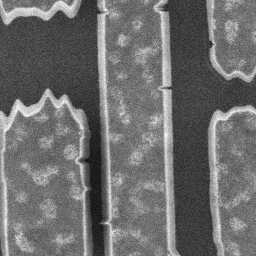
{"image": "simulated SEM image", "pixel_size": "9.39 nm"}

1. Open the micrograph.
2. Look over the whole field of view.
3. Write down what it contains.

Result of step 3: one or a few lines or trenches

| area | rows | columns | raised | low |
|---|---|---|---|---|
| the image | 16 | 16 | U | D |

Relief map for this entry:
UUUUUDUUUUDDDUUU
DDDDDDUUUUDDDUUU
DDDDDDUUUUDDDUUU
DDDDDDUUUUDDDUUU
DDDDDDUUUUDDDDUU
DDDDDDUUUUDDDDDD
DDDUDDUUUUDDDDDD
DUUUUDDUUUDDDUUU
UUUUUDDUUUUDDUUU
UUUUUDDUUUUDDUUU
UUUUUDDUUUUDDUUU
UUUUUDDUUUUDDUUU
UUUUUDDUUUUDDUUU
UUUUUDDUUUUDDUUU
UUUUUDDUUUUDDDUU
UUUUUDDUUUUDDDUU